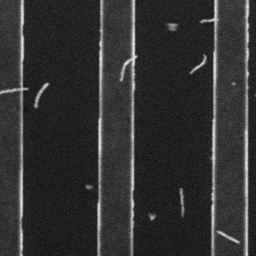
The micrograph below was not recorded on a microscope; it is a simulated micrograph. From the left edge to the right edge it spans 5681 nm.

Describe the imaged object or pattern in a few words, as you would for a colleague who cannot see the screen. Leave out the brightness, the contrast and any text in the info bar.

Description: lines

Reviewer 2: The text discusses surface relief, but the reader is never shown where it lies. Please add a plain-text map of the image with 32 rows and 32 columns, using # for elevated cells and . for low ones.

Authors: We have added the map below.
###..........####..........####.
###..........####..........####.
###..........####..........####.
###..........####..........####.
###..........####..........####.
###..........####..........####.
###..........####..........####.
###..........####..........####.
###..........####..........####.
###..........####..........####.
###..........####..........####.
###..........####..........####.
###..........####..........####.
###..........####..........####.
###..........####..........####.
###.........#####..........####.
###.........#####..........####.
###.........#####..........####.
###.........#####..........####.
###.........#####..........####.
###.........#####..........####.
###.........#####..........####.
###.........#####..........####.
###.........#####..........####.
###.........#####..........####.
###.........#####..........####.
###.........#####..........####.
###.........#####..........####.
###.........#####..........####.
###.........#####..........####.
###.........#####..........####.
###.........#####..........####.